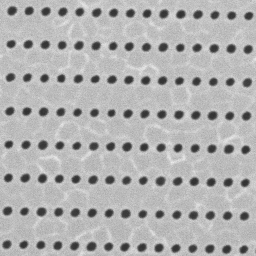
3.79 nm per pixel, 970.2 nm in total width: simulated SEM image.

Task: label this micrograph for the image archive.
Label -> a regular array of holes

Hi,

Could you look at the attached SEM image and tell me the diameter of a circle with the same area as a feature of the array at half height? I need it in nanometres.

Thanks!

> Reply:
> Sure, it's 33.1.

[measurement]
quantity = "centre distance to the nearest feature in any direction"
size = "63.4 nm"